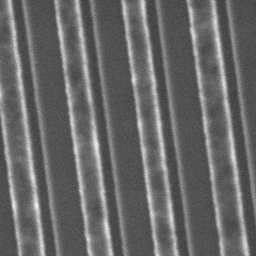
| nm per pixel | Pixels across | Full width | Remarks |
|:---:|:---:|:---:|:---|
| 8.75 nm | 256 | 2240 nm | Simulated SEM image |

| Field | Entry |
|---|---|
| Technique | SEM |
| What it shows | lines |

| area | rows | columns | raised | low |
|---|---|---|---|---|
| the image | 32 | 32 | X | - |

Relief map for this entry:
X------XXX-----XXX------XXX-----
X------XXX-----XXX------XXX-----
XX-----XXX------XX------XXX-----
XX-----XXX------XX------XXX-----
XX-----XXX------XX------XXX-----
XX------XX------XXX-----XXX-----
XX------XXX-----XXX-----XXXX----
XX------XXX-----XXX-----XXXX----
XX------XXX-----XXX------XXX----
XXX-----XXX-----XXX------XXX----
XXX-----XXX------XX------XXX----
XXX-----XXX------XX------XXX----
XXX------XX------XXX-----XXX----
XXX------XXX-----XXX-----XXX----
XXX------XXX-----XXX-----XXXX---
XXX------XXX-----XXX------XXX---
XXX------XXX-----XXX------XXX---
-XXX-----XXX------XX------XXX---
-XXX-----XXX------XX------XXX---
-XXX-----XXX------XX------XXX---
-XXX------XX------XXX-----XXX---
-XXX------XXX-----XXX-----XXXX--
-XXX------XXX-----XXX-----XXXX--
-XXX------XXX-----XXX------XXX--
-XXXX-----XXX-----XXX------XXX--
--XXX-----XXX------XX------XXX--
--XXX-----XXX------XX------XXX--
--XXX------XX------XXX-----XXX--
--XXX------XXX-----XXX-----XXX--
--XXX------XXX-----XXX-----XXXX-
--XXX------XXX-----XXX------XXX-
--XXX------XXX-----XXX------XXX-